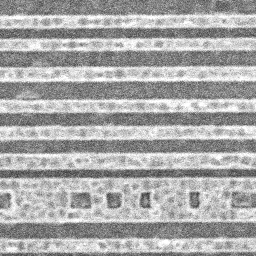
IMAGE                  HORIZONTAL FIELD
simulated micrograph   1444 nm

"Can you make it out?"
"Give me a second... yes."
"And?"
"parallel lines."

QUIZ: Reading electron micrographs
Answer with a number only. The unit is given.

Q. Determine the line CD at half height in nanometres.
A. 67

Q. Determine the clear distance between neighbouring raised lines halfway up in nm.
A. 91.7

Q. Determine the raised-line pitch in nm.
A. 158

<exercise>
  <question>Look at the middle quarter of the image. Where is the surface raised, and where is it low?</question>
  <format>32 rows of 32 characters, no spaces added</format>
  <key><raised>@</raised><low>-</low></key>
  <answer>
--------------------------------
@@@@@@@@@@@@@@@@@@@@@@@@@@@@@@@@
@@@@@@@@--@@@@@@@@@@@@@@@@@@@@@@
@@@@@@@@@@@@@@@@@@@@@@@@@@@@@@@@
--------------------------------
--------------------------------
--------------------------------
--------------------------------
--------------------------------
@@@@@@@@@@@@@@@@@@@@@@@@@@@@@@@@
@@@@@@@@@@@@@@@@@@@@@@@@@@@@@@@@
@@@@@@@@@@@@@@@@@@@@@@@@@@@@@@@@
--------------------------------
--------------------------------
--------------------------------
--------------------------------
@@@@@@@@@@@@@@@@@@@@@@@@@@@@@@@@
@@@@@@@@@@@@@@@@@@@@@@@@@@@@@@@@
@-@@@@@--@@@@@@@@@@@@@@@@--@----
--------------------------------
--------------------------------
--------------------------------
--------------------------@@@@@-
@@@@@@@@@@@@@@@@@@@@@@@@@@@@@@@@
@@@@@@@@@@@@@@@@@@@@@@@@@@@@@@@@
@@@@@@@@@@@@@@@@@@@@@@@@@@@@@@@@
--------------------------------
--------------------------------
--------------------------------
@@@@@@@@@@@@@@@@@@@@@@@@@@@@@@@@
@@@@@@@@@@@@@@@@@@@@@@@@@@@@@@@@
@@@@@@@@@@@@@@@@@@@@@@@@@@@@@@@@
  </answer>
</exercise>